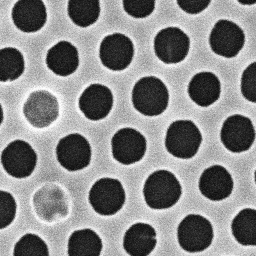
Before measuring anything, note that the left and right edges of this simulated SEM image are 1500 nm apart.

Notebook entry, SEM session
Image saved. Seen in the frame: a regular array of holes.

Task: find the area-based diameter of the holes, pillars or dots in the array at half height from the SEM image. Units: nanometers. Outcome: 220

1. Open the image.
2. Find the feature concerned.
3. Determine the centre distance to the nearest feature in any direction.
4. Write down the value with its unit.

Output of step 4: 54.4 pixels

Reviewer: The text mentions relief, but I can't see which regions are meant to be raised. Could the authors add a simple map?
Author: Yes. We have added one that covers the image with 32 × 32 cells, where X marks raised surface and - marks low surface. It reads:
XX----XX-----XX----XXX----XXXX--
X-----XX-----XXX---XXXX--XXXXXXX
XX----XXX---XXXXXXXXXXXXXXX--XXX
XX---XXXXXXXXXXXXXXX--XXXXX---XX
XXXXXXXXXXXXX---XXX-----XX-----X
XXXXXXX--XXX-----XX-----XX-----X
---XXX----XX-----XX-----XXX---XX
---XXX----XX-----XXX---XXXXXXXXX
---XXX----XXX---XXXXXXXXXXXXXXX-
---XXXX--XXXXXXXXX-XXXXX---XXX--
XXXXXXXXXXX--XXXX----XXX----XX--
XXXXXXXXXX----XX-----XX-----XX--
XXXXXXXXXX----XX-----XXX---XXXX-
XXXXXXXXXX----XXX----XXXXXXXXXXX
XXXXXXXXXXX--XXXXX-XXXXXXXXXX--X
XXXXXXXXXXXXXXXXXXXXX---XXXX----
XXXXXXXXXXXXXXX--XXXX----XX-----
XX-XXXX----XXX----XXX----XXX----
X---XXX----XXX----XXX----XXX---X
-----XX----XXX----XXXX--XXXXXXXX
-----XX----XXXX--XXXXXXXXXXXXXXX
X---XXXXXXXXXXXXXXX--XXXX----XXX
XXXXXXXXXXXX---XXX----XXX----XXX
XXXXXXXXXXX----XXX-----XX----XXX
--XXXXXXXXX-----XX-----XX----XXX
--XXXXXXXXX-----XX----XXXXXXXXXX
--XXXXXXXXXX---XXXXXXXXXXXXXXX--
--XXXXXXXXXXXXXXXXXXXXX---XXX---
-XXXXXXXXXXXXXXX---XXX-----XX---
XXX--XXXX---XXX-----XX-----XX---
XX----XX-----XX-----XX----XXXX--
XX----XX-----XXX---XXXX--XXXXXXX